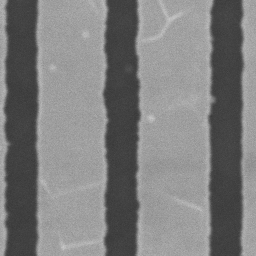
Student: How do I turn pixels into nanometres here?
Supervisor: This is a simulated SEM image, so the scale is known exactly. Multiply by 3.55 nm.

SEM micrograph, lines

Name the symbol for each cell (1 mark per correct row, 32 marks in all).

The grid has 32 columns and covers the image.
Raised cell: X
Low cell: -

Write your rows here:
X----XXXXXXXX----XXXXXXXXX----XX
X----XXXXXXXX----XXXXXXXXX-----X
X----XXXXXXXX----XXXXXXXXX----XX
X----XXXXXXXX----XXXXXXXXX----XX
X----XXXXXXXX----XXXXXXXXX-----X
X----XXXXXXXX----XXXXXXXXX----XX
X----XXXXXXXX----XXXXXXXXX----XX
X----XXXXXXXX----XXXXXXXXX-----X
X----XXXXXXXX----XXXXXXXXX----XX
X----XXXXXXXX----XXXXXXXXX----XX
X----XXXXXXXX-----XXXXXXXX----XX
X----XXXXXXXX----XXXXXXXXX----XX
X----XXXXXXXX----XXXXXXXXX----XX
-----XXXXXXXX----XXXXXXXXX----XX
X----XXXXXXXX-----XXXXXXXX----XX
-----XXXXXXXX----XXXXXXXXX----XX
X----XXXXXXXX----XXXXXXXXX----XX
X----XXXXXXXX----XXXXXXXXX----XX
X----XXXXXXXX----XXXXXXXXX----XX
X----XXXXXXXX----XXXXXXXXX----XX
X----XXXXXXXX----XXXXXXXXX----XX
X----XXXXXXXX----XXXXXXXXX----XX
X----XXXXXXXX----XXXXXXXXX----XX
X----XXXXXXXX----XXXXXXXXX----XX
X----XXXXXXXX----XXXXXXXXX----XX
X----XXXXXXXX----XXXXXXXXX----XX
X----XXXXXXXX----XXXXXXXXX----XX
-----XXXXXXXX----XXXXXXXXX----XX
X----XXXXXXXX----XXXXXXXXX----XX
X----XXXXXXXX----XXXXXXXXX----XX
X----XXXXXXXX----XXXXXXXXX----XX
X----XXXXXXXX----XXXXXXXXX----XX